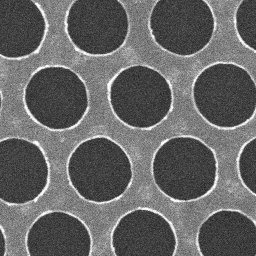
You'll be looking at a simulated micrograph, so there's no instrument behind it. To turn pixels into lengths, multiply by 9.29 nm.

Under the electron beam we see holes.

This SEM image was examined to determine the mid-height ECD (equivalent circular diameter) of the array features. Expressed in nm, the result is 588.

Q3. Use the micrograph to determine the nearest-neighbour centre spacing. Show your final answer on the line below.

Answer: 781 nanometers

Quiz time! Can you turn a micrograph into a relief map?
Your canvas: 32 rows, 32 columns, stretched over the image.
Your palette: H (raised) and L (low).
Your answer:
LLLLHHHHHLLLLLLHHHHHLLLLLLHHHHLL
LLLLLHHHHLLLLLLLHHHLLLLLLLHHHHLL
LLLLLLHHLLLLLLLLHHHLLLLLLLLHHLLL
LLLLLLHHLLLLLLLLHHHLLLLLLLLHHHLL
LLLLLHHHHLLLLLLLHHHLLLLLLLHHHHLL
LLLLLHHHHLLLLLLHHHHHLLLLLLHHHHHL
LLLLHHHHHHHLLLHHHHHHHLLLLHHHHHHH
HHHHHHHHHHHHHHHHHHHHHHHHHHHHHHHH
HHHHHHLLHHHHHHHHLLLHHHHHHHLLLLHH
HHHHLLLLLLHHHHHLLLLLHHHHHLLLLLLH
HHHLLLLLLLHHHHLLLLLLLHHHLLLLLLLL
HHHLLLLLLLLHHHLLLLLLLHHHLLLLLLLL
HHHLLLLLLLLHHHLLLLLLLLHHLLLLLLLL
HHHLLLLLLLLHHHLLLLLLLHHHHLLLLLLL
HHHHLLLLLLHHHHHLLLLLLHHHHLLLLLLH
HHHHHLLLLHHHHHHHLLLLHHHHHHHLLLHH
HHHHHHHHHHHHHHHHHHHHHHHHHHHHHHHH
HLLHHHHHHHHLLLHHHHHHHLLLLHHHHHHL
LLLLLHHHHHLLLLLHHHHHLLLLLLHHHHLL
LLLLLHHHHLLLLLLLHHHLLLLLLLLHHHLL
LLLLLLHHHLLLLLLLHHHLLLLLLLLHHHLL
LLLLLLHHHLLLLLLLHHHLLLLLLLLHHHLL
LLLLLLHHHLLLLLLLHHHLLLLLLLLHHHLL
LLLLLLHHHLLLLLLLHHHHLLLLLLHHHHHL
LLLLLHHHHHLLLLLHHHHHHLLLLHHHHHHH
HHHHHHHHHHHHHHHHHHHHHHHHHHHHHHHH
HHHHHHLLHHHHHHHHHLLHHHHHHHHLLLHH
HHHHHLLLLLHHHHHLLLLLLHHHHHLLLLLH
HHHHLLLLLLLHHHLLLLLLLHHHHLLLLLLL
LHHLLLLLLLLHHHLLLLLLLLHHHLLLLLLL
LHHLLLLLLLLHHHLLLLLLLLHHHLLLLLLL
LHHHLLLLLLLHHHLLLLLLLLHHHLLLLLLL